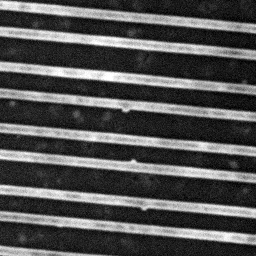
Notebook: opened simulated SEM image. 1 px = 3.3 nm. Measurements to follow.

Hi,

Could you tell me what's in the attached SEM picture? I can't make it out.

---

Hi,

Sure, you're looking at parallel lines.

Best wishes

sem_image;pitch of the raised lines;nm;99.1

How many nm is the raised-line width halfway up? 29.6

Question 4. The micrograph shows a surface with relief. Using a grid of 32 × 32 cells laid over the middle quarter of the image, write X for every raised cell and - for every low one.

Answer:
--------------------------------
XXXXX---------------------------
XXXXXXXXXXXXXXXX----------------
----XXXXXXXXXXXXXXXXXXXXXX------
---------------XXXXXXXXXXXXXXXXX
--------------------------XXXXXX
--------------------------------
--------------------------------
XXXXXXXX------------------------
XXXXXXXXXXXXXXXXXX--------------
---------XXXXXXXXXXXXXXXXXXXX---
---------------X----XXXXXXXXXXXX
----------------------------XXXX
--------------------------------
--------------------------------
--------------------------------
X-------------------------------
XXXXXXXXXXXXX-------------------
-XXXXXXXXXXXXXXXXXXXX-----------
----------XXXXXXXXXXXXXXXXXXXXXX
-----------------------XXXXXXXXX
--------------------------------
--------------------------------
XXXXX---------------------------
XXXXXXXXXXXXXXX-XX--------------
----XXXXXXXXXXXXXXXXXXXXXX------
---------------XXXXXXXXXXXXXXXXX
-------------------------XXXXXXX
--------------------------------
--------------------------------
--------------------------------
--------------------------------